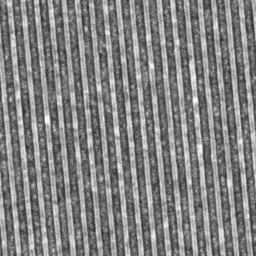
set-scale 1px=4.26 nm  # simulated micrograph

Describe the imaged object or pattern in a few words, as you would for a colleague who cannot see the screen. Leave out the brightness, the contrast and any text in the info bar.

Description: parallel lines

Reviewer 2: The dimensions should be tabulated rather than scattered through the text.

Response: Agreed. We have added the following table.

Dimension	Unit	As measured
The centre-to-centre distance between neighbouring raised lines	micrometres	0.0578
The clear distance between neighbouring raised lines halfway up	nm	39.8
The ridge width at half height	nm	15.9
